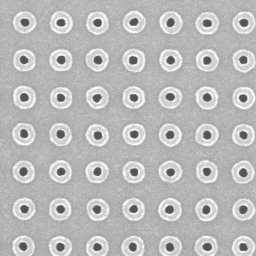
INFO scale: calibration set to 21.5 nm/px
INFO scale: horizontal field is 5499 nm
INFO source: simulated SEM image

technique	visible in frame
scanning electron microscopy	a regular array of ring-shaped raised bodies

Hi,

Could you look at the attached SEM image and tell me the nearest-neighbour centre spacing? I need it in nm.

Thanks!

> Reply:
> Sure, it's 779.